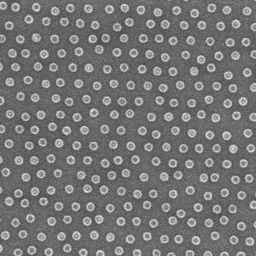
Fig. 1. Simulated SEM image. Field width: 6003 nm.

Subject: a regular array of raised bodies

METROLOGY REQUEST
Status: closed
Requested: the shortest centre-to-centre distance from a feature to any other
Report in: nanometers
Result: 347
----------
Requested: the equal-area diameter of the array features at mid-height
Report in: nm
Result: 172